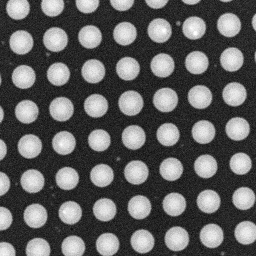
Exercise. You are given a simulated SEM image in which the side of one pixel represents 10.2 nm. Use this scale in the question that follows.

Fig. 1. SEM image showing an array of small figures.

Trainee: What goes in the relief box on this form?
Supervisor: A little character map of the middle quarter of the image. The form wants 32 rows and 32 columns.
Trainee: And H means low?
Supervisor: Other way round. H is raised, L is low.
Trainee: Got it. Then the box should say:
HLLLLHHHHHLLLHHHHHHLLLHHHHHLLLHH
HLLLHHHHHHLLLHHHHHHLLLHHHHHLLLLH
HLLLLHHHHHLLLHHHHHHLLLLHHHHLLLLL
HLLLLHHHHHLLLLHHHHLLLLLLLLLLLLLL
HLLLLLHHHLLLLLLLLLLLLLLLLLLLLLLL
LLLLLLLLLLLLLLLLLLLLLLLLLLLLLLLL
LLLLLLLLLLLLLLLLLLLLLLLLHHHLLLLL
LLLLLLLLLLLLLLLHHHHLLLLHHHHHLLLH
LLLLLLHHHHLLLLHHHHHHLLHHHHHHLLLH
HHLLLHHHHHHLLLHHHHHHLLHHHHHHLLLH
HHLLLHHHHHHLLLHHHHHHLLLHHHHHLLLL
HHLLLHHHHHHLLLHHHHHLLLLLHHHLLLLL
HHLLLLHHHHLLLLLHHHLLLLLLLLLLLLLL
HLLLLLLLLLLLLLLLLLLLLLLLLLLLLLLL
LLLLLLLLLLLLLLLLLLLLLLLLLLLLLLLL
LLLLLLLLLLLLLLLLHHLLLLLLHHHHLLLL
LLLLLLLLHHLLLLLHHHHHLLLHHHHHHLLL
HHLLLLHHHHHLLLLHHHHHLLLHHHHHHLLL
HHHLLLHHHHHLLLLHHHHHLLLHHHHHHLLL
HHHLLLHHHHHHLLLHHHHHLLLLHHHHLLLL
HHHLLLHHHHHLLLLHHHHLLLLLLLLLLLLL
HHLLLLLLHHLLLLLLLLLLLLLLLLLLLLLL
HLLLLLLLLLLLLLLLLLLLLLLLLLLLLLLL
LLLLLLLLLLLLLLLLLLLLLLLLLLHLLLLL
LLLLLLLLLLLLLLLLLHHHLLLLLHHHHLLL
LLLLLLLLHHHLLLLLHHHHHLLLHHHHHHLL
HHHLLLLHHHHHLLLHHHHHHLLLHHHHHHLL
HHHHLLLHHHHHLLLHHHHHHLLLHHHHHLLL
HHHHLLLHHHHHLLLHHHHHHLLLLHHHHLLL
HHHLLLLHHHHHLLLLHHHHLLLLLLLLLLLL
HHHLLLLLHHLLLLLLLLLLLLLLLLLLLLLL
LLLLLLLLLLLLLLLLLLLLLLLLLLLLLLLL